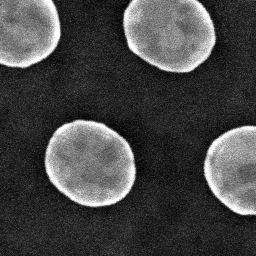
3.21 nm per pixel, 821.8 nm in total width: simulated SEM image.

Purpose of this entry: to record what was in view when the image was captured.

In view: raised bodies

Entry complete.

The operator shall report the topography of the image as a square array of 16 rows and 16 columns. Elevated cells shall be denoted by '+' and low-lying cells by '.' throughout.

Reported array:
+++.....+++++...
++++....+++++...
++++....+++++...
+++......++++...
................
................
................
................
...++++.......++
...+++++.....+++
...+++++.....+++
....++++.....+++
.....++.......++
................
................
................